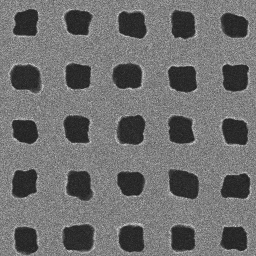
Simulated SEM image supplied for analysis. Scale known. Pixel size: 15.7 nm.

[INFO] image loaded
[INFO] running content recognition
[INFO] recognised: a regular array of holes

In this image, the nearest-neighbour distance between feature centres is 810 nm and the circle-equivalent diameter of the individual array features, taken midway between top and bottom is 433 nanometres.